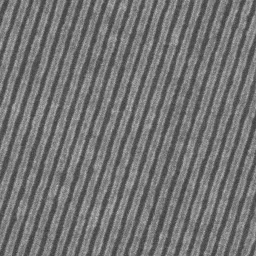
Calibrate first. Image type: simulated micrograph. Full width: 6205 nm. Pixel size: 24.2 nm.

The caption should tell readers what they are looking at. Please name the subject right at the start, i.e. parallel lines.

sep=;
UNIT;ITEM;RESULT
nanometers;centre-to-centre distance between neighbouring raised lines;288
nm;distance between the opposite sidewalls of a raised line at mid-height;124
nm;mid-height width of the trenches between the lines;165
